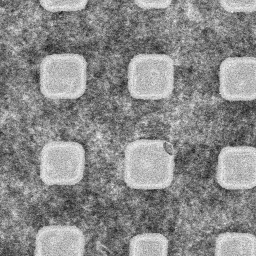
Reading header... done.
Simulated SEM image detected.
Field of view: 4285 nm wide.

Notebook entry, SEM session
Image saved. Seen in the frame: raised bodies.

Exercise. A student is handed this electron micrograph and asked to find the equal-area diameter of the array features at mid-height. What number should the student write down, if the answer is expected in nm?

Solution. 757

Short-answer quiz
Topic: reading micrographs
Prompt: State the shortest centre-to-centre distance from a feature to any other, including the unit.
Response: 1450 nm